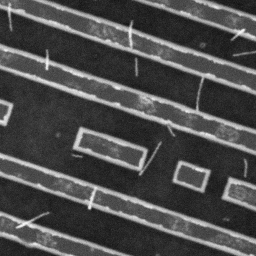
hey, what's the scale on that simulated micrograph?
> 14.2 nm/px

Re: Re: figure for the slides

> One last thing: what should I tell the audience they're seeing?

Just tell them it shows parallel lines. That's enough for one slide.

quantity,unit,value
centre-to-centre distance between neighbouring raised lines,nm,749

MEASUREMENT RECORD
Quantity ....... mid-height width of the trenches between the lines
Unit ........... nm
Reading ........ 497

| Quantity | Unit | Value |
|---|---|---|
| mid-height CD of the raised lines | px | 20.1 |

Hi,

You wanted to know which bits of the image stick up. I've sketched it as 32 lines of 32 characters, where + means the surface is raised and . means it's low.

+++++++............++++++++.....
..+++++++.............++++++++..
.....++++++++............+++++++
........++++++++............++++
...........+++++++.............+
..............+++++++...........
++...............+++++++........
++++++..............+++++++.....
++++++++...............+++++++..
...++++++++...............++++++
......++++++++...............+++
.........++++++++...............
............++++++++............
+..............++++++++.........
+.................++++++++......
.....................++++++++...
..........+.............++++++++
..........+++++............+++++
..........+++++++.............++
............++++++..............
+++............+++.....+........
++++++................++++......
..++++++++............++++......
.....+++++++............+...++++
........++++++++............++++
...........+++++++............++
..............+++++++...........
++...............+++++++........
+++++...............+++++++.....
.+++++++...............+++++++..
...++++++++...............++++++
.......+++++++...............+++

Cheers